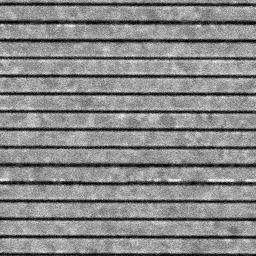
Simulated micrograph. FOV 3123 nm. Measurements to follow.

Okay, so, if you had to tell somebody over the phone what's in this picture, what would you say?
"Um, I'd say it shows parallel lines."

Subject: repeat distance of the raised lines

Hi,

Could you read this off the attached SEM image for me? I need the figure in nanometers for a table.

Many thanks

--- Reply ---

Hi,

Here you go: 218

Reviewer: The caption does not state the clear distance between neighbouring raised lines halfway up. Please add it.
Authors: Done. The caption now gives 56.4 nanometers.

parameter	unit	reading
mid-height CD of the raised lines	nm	171